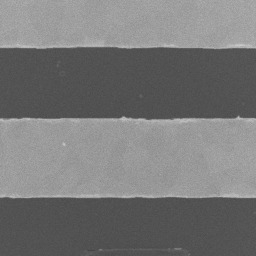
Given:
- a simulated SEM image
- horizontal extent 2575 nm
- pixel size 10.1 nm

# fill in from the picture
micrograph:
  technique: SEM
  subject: wiring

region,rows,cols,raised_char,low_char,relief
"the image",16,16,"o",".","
oooooooooooooooo
oooooooooooooooo
oooooooooooooooo
................
................
................
................
.oooooooo..ooooo
oooooooooooooooo
oooooooooooooooo
oooooooooooooooo
oooooooooooooooo
................
................
................
................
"